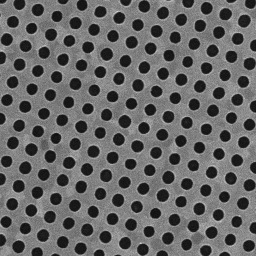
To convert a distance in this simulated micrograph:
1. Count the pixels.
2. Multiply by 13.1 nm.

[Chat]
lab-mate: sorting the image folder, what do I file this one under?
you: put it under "a regular array of holes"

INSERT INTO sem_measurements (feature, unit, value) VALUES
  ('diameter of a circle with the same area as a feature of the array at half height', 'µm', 0.16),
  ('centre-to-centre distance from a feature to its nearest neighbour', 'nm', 248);